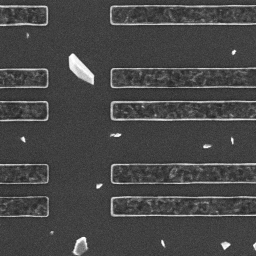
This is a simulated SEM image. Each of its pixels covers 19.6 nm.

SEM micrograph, wiring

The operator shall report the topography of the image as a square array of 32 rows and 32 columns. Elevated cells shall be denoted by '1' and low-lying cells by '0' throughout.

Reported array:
00000000000000000000000000000000
11111100000000111111111111111111
11111100000000111111111111111111
00000000000000000000000000000000
00000000000000000000000000000000
00000000000000000000000000000000
00000000000000000000000000000000
00000000010000000000000000000000
00000000011000000000000000000000
11111100001100111111111111111111
11111100000000111111111111111111
00000000000000000000000000000000
00000000000000000000000000000000
11111100000000111111111111111111
11111100000000111111111111111111
00000000000000000000000000000000
00000000000000000000000000000000
00000000000000000000000000000000
00000000000000000000000000000000
00000000000000000000000000000000
00000000000000000000000000000000
11111100000000111111111111111111
11111100000000111111111111111111
00000000000000000000000000000000
00000000000000000000000000000000
11111100000000111111111111111111
11111100000000111111111111111111
00000000000000000000000000000000
00000000000000000000000000000000
00000000000000000000000000000000
00000000001000000000000000000000
00000000000000000000000000000000